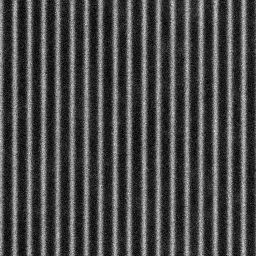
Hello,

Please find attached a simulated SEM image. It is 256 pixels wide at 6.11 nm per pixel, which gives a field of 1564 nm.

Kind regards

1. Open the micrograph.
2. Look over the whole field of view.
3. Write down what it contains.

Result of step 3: parallel lines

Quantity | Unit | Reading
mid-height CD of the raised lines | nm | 10.7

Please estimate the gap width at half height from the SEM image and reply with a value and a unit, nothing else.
73.3 nanometers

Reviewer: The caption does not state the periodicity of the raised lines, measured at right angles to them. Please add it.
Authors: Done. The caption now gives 14.3 px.